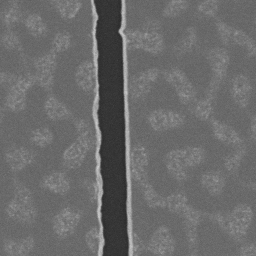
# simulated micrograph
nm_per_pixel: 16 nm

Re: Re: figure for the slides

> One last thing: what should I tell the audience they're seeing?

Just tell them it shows one or a few lines or trenches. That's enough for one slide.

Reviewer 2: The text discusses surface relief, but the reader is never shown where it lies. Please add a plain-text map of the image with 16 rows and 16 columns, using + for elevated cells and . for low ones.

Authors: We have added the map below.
++++++..++++++++
++++++..++++++++
++++++..++++++++
++++++..++++++++
++++++..++++++++
++++++..++++++++
++++++..++++++++
++++++..++++++++
++++++..++++++++
++++++..++++++++
++++++..++++++++
++++++..++++++++
++++++..++++++++
++++++..++++++++
++++++..++++++++
++++++..++++++++